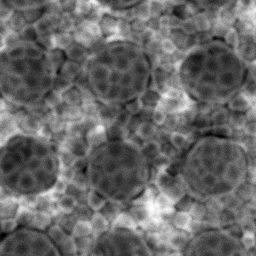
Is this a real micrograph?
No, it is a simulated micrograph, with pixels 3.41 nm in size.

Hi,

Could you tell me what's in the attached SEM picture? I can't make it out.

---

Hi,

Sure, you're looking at raised bodies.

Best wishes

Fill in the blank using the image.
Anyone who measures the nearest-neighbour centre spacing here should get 316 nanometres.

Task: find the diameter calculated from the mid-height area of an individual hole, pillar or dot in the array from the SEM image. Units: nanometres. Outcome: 196